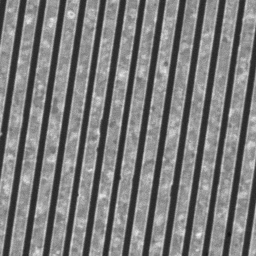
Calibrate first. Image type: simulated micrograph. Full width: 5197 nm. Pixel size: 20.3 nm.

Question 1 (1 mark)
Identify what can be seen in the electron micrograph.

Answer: parallel lines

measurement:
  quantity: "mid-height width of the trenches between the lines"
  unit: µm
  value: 0.156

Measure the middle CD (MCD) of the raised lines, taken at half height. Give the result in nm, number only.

234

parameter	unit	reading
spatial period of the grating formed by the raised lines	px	19.7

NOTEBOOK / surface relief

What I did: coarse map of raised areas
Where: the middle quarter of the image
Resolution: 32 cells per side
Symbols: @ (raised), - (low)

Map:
@---@@--@@@--@@@--@@@--@@@--@@@-
@--@@@--@@@--@@@--@@@--@@@--@@@-
@--@@@--@@@--@@@--@@@--@@@--@@@-
@--@@@--@@@--@@@--@@@--@@@--@@@-
@--@@@--@@@--@@@--@@@--@@@--@@@-
@--@@@--@@---@@@--@@@--@@---@@--
--@@@---@@---@@--@@@--@@@--@@@--
--@@@--@@@--@@@--@@@--@@@--@@@--
--@@@--@@@--@@@--@@@--@@@--@@@--
--@@@--@@@--@@@--@@@--@@@--@@@--
--@@@--@@@--@@@--@@@--@@@--@@@--
--@@@--@@@--@@@--@@@--@@@--@@@--
--@@@--@@---@@---@@@--@@---@@---
--@@---@@---@@--@@@--@@@---@@--@
-@@@--@@@--@@@--@@@--@@@--@@@--@
-@@@--@@@--@@@--@@@--@@@--@@@--@
-@@@--@@@--@@@--@@@--@@@--@@@--@
-@@@--@@@--@@@--@@@--@@@--@@@--@
-@@@--@@@--@@@--@@---@@---@@@--@
-@@@--@@---@@---@@---@@---@@---@
@@@--@@@---@@--@@@--@@@---@@---@
@@@--@@@--@@@--@@@--@@@--@@@--@@
@@@--@@@--@@@--@@@--@@@--@@@--@@
@@@--@@@--@@@--@@@--@@@--@@@--@@
@@@--@@@--@@@--@@@--@@@--@@@--@@
@@@--@@---@@@--@@---@@---@@@--@@
@@@--@@---@@--@@@---@@--@@@---@@
@@--@@@---@@--@@@--@@@--@@@---@@
@@--@@@--@@@--@@@--@@@--@@@--@@@
@@--@@@--@@@--@@@--@@@--@@@--@@@
@@--@@@--@@@--@@@--@@@--@@@--@@@
@@--@@@--@@@--@@@--@@@--@@---@@-